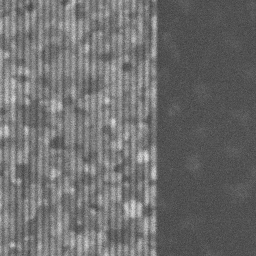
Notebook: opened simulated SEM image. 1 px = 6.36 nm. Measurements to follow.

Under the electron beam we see parallel lines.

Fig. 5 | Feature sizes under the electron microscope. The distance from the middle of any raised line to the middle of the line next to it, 42.5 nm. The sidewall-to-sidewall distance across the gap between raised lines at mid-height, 0.0167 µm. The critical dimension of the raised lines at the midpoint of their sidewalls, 27.8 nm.